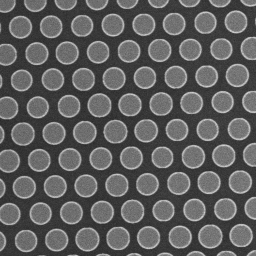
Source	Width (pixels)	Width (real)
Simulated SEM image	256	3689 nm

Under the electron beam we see an array of small figures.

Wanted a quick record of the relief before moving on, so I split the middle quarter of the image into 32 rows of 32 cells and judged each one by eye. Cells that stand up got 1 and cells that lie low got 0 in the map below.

00000000000000000000000000010000
00011110000111000011110000111100
00111110001111100011111001111110
00111111001111100011111001111110
00111111001111100011111001111100
00011110001111100011110000111100
00001100000000000000000000000000
00000000110000011000000111000011
11100001111000111110001111100111
11110011111100111110011111100111
11110011111100111110011111100111
11110011111100111110001111100011
11100001111000011100000111000000
00000000000000000000000000000000
00001100000111000001110000111100
00011111001111100011111000111110
00111111001111110011111001111110
00111111001111110011111000111110
00011111001111100011111000111100
00001110000111000000100000000000
00000000000000000000000000000001
11100001111000011110000111100011
11110001111100111111001111100011
11110011111100111111001111100011
11110011111100111110001111100011
11110001111000011110000111000001
01000000000000000000000000000000
00000000000001000000110000011100
00011110000111100001111000111110
00011111001111110011111100111111
10011111001111110011111100111111
00011111000111110011111000111110